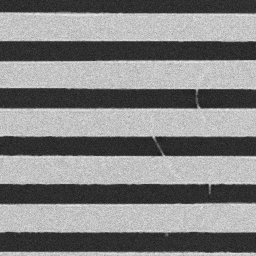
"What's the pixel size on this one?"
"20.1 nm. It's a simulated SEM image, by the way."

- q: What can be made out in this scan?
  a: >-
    lines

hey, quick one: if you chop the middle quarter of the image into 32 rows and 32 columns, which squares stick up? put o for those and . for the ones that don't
oooooooooooooooooooooooooooooooo
oooooooooooooooooooooooooooooooo
oooooooooooooooooooooooooooooooo
oooooooooooooooooooooooooooooooo
oooooooooooooooooooooooooooooooo
oooooooooooooooooooooooooooooooo
................................
................................
................................
................................
................................
oooooooooooooooooooooooooooooooo
oooooooooooooooooooooooooooooooo
oooooooooooooooooooooooooooooooo
oooooooooooooooooooooooooooooooo
oooooooooooooooooooooooooooooooo
oooooooooooooooooooooooooooooooo
oooooooooooooooooooooooooooooooo
......................o.........
................................
................................
................................
................................
oooooooooooooooooooooooooooooooo
oooooooooooooooooooooooooooooooo
oooooooooooooooooooooooooooooooo
oooooooooooooooooooooooooooooooo
oooooooooooooooooooooooooooooooo
oooooooooooooooooooooooooooooooo
oooooooooooooooooooooooooooooooo
................................
................................